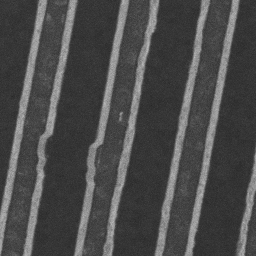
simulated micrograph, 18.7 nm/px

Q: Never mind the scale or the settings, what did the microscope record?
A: one or a few lines or trenches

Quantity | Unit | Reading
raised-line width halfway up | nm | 939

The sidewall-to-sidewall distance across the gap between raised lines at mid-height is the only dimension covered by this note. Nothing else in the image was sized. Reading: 561 nm